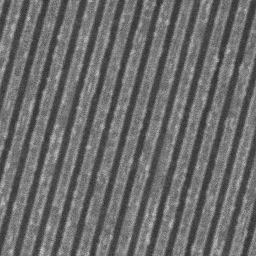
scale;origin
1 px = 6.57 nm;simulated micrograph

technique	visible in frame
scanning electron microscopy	parallel lines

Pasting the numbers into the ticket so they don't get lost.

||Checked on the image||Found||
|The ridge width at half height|69.1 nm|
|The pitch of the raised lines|18.4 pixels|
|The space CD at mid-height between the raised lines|50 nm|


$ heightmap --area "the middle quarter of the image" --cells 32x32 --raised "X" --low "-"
--XX--XXX--XXX--XXX--XX--XXX--XX
-XXX--XXX--XXX-XXX--XXX--XXX--XX
-XXX--XXX--XX--XXX--XXX--XX--XXX
-XXX--XXX-XXX--XXX--XX--XXX--XXX
XXX--XXX--XXX--XX---XX--XXX--XXX
XXX--XXX--XXX--XX--XXX--XXX--XXX
XXX--XXX--XX--XXX--XXX--XX---XX-
XXX-XXX--XXX--XXX--XX--XXX--XXX-
XX--XXX--XXX--XX--XXX--XXX--XXX-
XX--XXX--XXX--XX--XXX--XXX--XX--
XX--XXX--XX--XXX--XXX--XX---XX--
X--XXX--XXX--XXX--XXX-XXX--XXX--
X--XXX--XXX--XX--XXX--XXX--XXX-X
X--XXX--XX--XXX--XXX--XXX--XX--X
X--XX--XXX--XXX--XXX--XX--XXX--X
--XXX--XXX--XXX--XXX-XXX--XXX--X
--XXX--XXX-XXX--XXX--XXX--XXX--X
--XXX--XX--XXX--XXX--XXX--XX--XX
--XX--XXX--XXX--XX--XXX--XXX--XX
-XXX--XXX--XXX--XX--XXX--XXX--XX
-XXX--XXX--XX--XXX--XXX--XXX-XXX
-XXX--XX--XXX--XXX--XX---XX--XXX
-XX--XXX--XXX--XX--XXX--XXX--XXX
XXX--XXX--XX--XXX--XXX--XXX--XX-
XXX--XX---XX--XXX--XXX--XXX-XXX-
XXX--XX--XXX--XXX--XX---XX--XXX-
XX--XXX--XXX--XX--XXX--XXX--XXX-
XX--XXX-XXX--XXX--XXX--XXX--XX--
XX--XX--XXX--XXX--XXX--XX--XXX--
X--XXX--XXX--XXX--XX--XXX--XXX--
X--XXX--XXX--XX--XXX--XXX--XXX--
X--XXX--XX--XXX--XXX--XXX--XX--X